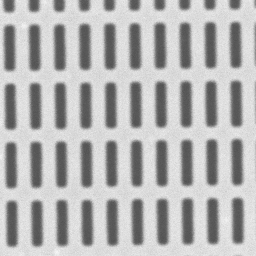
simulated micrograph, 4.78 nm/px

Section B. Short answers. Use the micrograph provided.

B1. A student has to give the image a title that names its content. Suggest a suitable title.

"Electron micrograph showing groups of lines, slits or small figures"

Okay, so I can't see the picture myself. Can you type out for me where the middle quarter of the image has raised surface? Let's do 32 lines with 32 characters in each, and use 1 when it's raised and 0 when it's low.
01110001110001110001111000111000
11111011111011111111111111111111
11111111111111111111111111111111
11111111111111111111111111111111
11111011111001111001111001111000
01110001110001110000111000111000
01110001110001110000111000111000
01110001110001110000111000111000
01110001110001110000111000111000
01110001110001110000111000111000
01110001110001110000111000111000
01110001110001110000111000111000
01110001110001110000111000111000
01110001110001110000111000111000
01110001110001110000111000111000
01110001110001111001111000111000
11111111111111111111111111111111
11111111111111111111111111111111
11111111111111111111111111111111
01110001111001111000111000111000
01110001110001110000111000111000
01110001110000110000111000111000
01110001110000110000111000111000
01110001110000110000111000111000
01110001110000111000111000111000
01110001110000111000111000111000
01110001110000111000111000111000
01110001110000111000111000111000
01110001110000111000111000111000
01110001110000111000111000111000
01110001111001111001111101111100
11111111111111111111111111111111